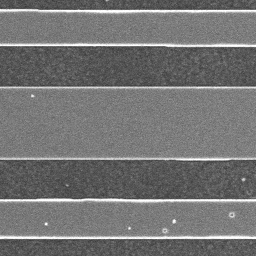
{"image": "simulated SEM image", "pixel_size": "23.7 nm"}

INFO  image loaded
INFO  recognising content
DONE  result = lines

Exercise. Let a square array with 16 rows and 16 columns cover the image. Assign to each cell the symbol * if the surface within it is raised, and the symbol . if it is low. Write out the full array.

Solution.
................
****************
****************
................
................
****************
****************
****************
****************
****************
................
................
.....*..........
****************
****************
................